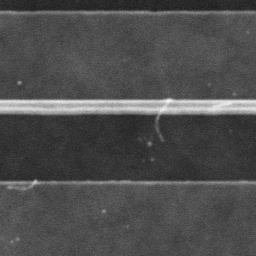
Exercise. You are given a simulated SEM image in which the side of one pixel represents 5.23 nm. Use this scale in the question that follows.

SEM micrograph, lines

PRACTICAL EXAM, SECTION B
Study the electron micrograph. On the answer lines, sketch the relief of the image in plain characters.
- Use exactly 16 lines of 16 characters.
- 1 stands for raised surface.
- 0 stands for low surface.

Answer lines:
0000000000000000
1111111111111111
1111111111111111
1111111111111111
1111111111111111
1111111111111111
1111111111111111
0000000000000000
0000000000000000
0000000000000000
0000000000000000
1111111111111111
1111111111111111
1111111111111111
1111111111111111
1111111111111111